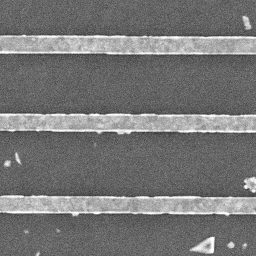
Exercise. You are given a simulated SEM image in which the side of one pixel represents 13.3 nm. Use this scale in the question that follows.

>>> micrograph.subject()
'lines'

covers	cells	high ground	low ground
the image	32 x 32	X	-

--------------------------------
--------------------------------
--------------------------------
--------------------------------
--------------------------------
XXXXXXXXXXXXXXXXXXXXXXXXXXXXXXXX
XXXXXXXXXXXXXXXXXXXXXXXXXXXXXXXX
--------------------------------
--------------------------------
--------------------------------
--------------------------------
--------------------------------
--------------------------------
--------------------------------
XXXXXXXXXXXXXXXXXXXXXXXXXXXX--XX
XXXXXXXXXXXXXXXXXXXXXXXXXXXXXXXX
--------------------------------
--------------------------------
--------------------------------
--------------------------------
--------------------------------
--------------------------------
--------------------------------
--------------------------------
--------------------------------
XXXXXXXXXXXXXXXXXXXXXXXXXXXXXXXX
-XXXXXXXXXXXXXXXXXXXXXXXXXXXXXXX
--------------------------------
--------------------------------
--------------------------------
--------------------------------
--------------------------------